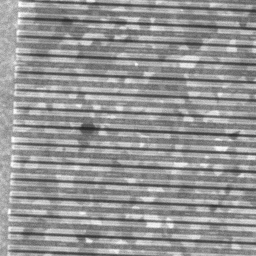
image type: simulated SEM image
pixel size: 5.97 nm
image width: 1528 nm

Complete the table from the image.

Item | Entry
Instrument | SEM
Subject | parallel lines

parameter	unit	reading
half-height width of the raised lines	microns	0.0253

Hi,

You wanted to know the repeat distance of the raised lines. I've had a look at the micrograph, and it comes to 53.4 nm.